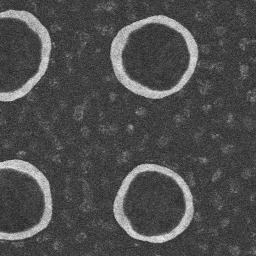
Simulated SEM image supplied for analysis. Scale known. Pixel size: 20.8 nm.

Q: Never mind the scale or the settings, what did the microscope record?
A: raised bodies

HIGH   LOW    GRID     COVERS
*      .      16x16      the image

................
**......***.....
***....*****....
***....*****....
***.....****....
**......***.....
................
................
................
................
**..............
***.....***.....
***....*****....
***....*****....
**......***.....
................